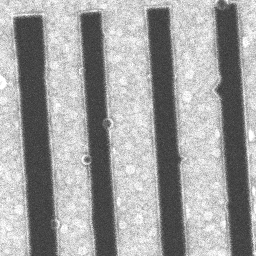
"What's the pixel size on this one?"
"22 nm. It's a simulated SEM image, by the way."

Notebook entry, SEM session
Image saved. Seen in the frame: one or a few lines or trenches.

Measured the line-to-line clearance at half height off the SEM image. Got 892 nanometers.